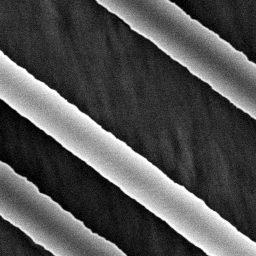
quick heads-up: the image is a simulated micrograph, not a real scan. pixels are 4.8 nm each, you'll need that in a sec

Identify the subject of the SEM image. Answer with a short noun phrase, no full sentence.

lines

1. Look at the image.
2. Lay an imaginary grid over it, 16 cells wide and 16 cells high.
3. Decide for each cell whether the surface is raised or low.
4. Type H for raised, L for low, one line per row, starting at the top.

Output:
LLLLLLLHHHHLLLLL
LLLLLLLLHHHHHLLL
LLLLLLLLLHHHHHLL
LLLLLLLLLLLHHHHL
HHLLLLLLLLLLHHHH
HHHLLLLLLLLLLHHH
HHHHLLLLLLLLLLLH
LLHHHHLLLLLLLLLL
LLLHHHHLLLLLLLLL
LLLLHHHHLLLLLLLL
HLLLLLHHHHLLLLLL
HHLLLLLHHHHLLLLL
HHHLLLLLHHHHHLLL
HHHHHLLLLLHHHHLL
LHHHHHLLLLLHHHHL
LLLHHHHLLLLLHHHH